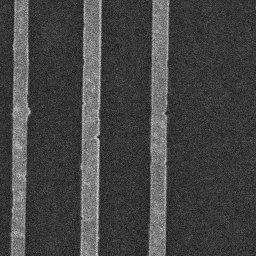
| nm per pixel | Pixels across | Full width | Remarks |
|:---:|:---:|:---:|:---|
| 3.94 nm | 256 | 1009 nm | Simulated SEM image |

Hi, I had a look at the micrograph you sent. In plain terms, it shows one or a few lines or trenches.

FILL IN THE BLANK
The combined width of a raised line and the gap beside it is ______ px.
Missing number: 69.4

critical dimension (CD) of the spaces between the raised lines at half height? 0.215 um